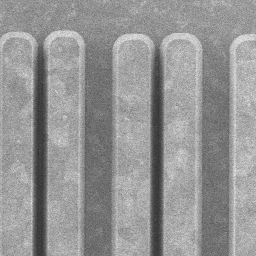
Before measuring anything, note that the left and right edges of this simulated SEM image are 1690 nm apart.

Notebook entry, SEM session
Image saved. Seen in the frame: parallel lines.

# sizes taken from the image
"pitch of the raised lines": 384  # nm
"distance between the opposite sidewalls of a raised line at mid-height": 244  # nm